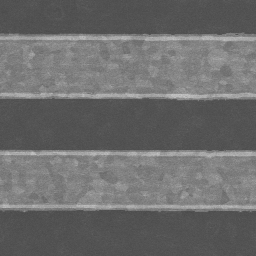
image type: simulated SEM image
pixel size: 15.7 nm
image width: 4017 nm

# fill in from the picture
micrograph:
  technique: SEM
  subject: one or a few lines or trenches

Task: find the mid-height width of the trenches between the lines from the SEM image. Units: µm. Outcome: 0.911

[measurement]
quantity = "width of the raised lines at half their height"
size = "869 nanometres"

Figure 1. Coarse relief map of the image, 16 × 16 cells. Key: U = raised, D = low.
DDDDDDDDDDDDDDDD
DDDDDDDDDDDDDDDD
UUUUUUUUUUUUUUUU
UUUUUUUUUUUUUUUU
UUUUUUUUUUUUUUUU
UUUUUUUUUUUUUUUU
DDDDDDDDDDDDDDDD
DDDDDDDDDDDDDDDD
DDDDDDDDDDDDDDDD
DDDDDDDDDDDDDDDD
UUUUUUUUUUUUUUUU
UUUUUUUUUUUUUUUU
UUUUUUUUUUUUUUUU
DDDDDDDDDDDDDDDD
DDDDDDDDDDDDDDDD
DDDDDDDDDDDDDDDD